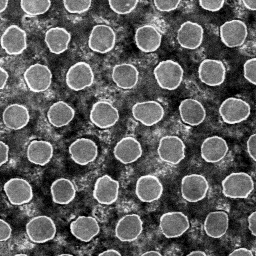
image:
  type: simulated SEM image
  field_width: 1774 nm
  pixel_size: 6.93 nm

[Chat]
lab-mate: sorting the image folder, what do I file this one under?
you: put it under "a regular array of raised bodies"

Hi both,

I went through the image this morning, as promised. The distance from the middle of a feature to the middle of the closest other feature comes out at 295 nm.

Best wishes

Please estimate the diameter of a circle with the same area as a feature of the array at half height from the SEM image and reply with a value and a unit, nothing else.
180 nm